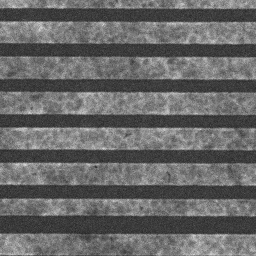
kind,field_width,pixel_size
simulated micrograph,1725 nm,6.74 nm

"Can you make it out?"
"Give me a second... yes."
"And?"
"parallel lines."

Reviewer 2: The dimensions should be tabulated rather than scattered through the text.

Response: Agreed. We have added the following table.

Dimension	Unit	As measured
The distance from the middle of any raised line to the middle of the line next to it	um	0.236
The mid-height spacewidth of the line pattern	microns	0.0977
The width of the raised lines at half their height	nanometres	136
